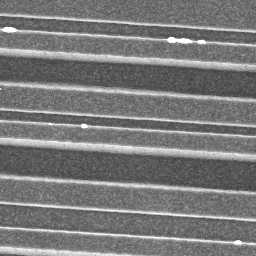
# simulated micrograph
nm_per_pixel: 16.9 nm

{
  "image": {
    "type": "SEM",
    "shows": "lines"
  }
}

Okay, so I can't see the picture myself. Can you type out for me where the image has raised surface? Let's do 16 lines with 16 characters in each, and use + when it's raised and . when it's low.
++++++++++++++++
++++++++++++++++
++++++++++++++++
.....+++++++++++
................
++++............
++++++++++++++++
++++++++++++++++
++++++++++++++++
............++++
................
+++++++.........
++++++++++++++++
++++++++++++++++
++++++++++++++++
++++++++++++++++